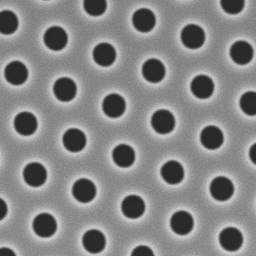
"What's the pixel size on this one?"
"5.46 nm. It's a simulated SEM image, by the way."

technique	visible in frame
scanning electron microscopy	a regular array of holes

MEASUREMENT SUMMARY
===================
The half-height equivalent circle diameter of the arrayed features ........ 0.13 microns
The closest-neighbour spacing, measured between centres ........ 280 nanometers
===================